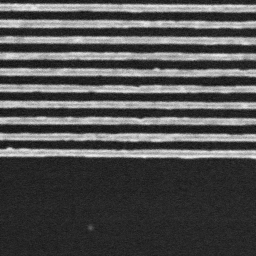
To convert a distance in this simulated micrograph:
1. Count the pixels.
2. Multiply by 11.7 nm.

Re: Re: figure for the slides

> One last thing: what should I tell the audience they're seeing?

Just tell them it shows parallel lines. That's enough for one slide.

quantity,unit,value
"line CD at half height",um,0.0598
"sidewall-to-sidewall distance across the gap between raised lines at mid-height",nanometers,130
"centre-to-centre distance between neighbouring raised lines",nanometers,189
